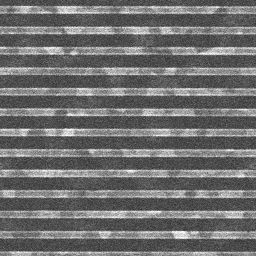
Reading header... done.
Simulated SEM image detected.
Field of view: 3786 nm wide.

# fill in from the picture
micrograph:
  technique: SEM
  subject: parallel lines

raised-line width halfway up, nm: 90.6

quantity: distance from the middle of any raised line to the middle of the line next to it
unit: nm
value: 303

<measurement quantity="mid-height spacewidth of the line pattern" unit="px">14.5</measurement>